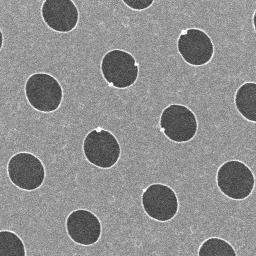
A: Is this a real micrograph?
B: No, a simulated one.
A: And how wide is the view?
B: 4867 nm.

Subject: a regular array of holes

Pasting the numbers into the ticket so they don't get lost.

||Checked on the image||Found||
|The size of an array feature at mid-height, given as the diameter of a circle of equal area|701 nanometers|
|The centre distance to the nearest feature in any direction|1500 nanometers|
